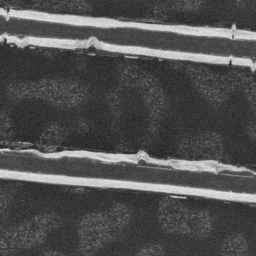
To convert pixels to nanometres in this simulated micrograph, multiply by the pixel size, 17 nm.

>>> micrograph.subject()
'one or a few lines or trenches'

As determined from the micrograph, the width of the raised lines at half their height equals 432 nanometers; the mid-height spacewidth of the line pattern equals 1.84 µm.